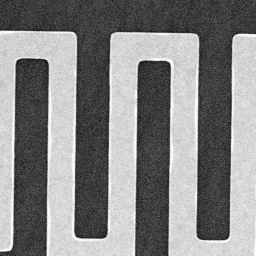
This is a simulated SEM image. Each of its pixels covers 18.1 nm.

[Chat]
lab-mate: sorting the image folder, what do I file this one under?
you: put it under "groups of lines, slits or small figures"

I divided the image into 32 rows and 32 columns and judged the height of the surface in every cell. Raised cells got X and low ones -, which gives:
--------------------------------
--------------------------------
--------------------------------
--------------------------------
XXXXXXXXX-----XXXXXXXXXX-----XXX
XXXXXXXXXX----XXXXXXXXXXX----XXX
XXXXXXXXXX----XXXXXXXXXXX----XXX
XX----XXX-----XXXX---XXXX----XXX
XX----XXX-----XXX-----XXX----XXX
XX----XXX-----XXX-----XXX----XXX
XX----XXX-----XXX----XXXX----XXX
XX----XXX-----XXX----XXXX----XXX
XX----XXX-----XXX-----XXX----XXX
XX----XXX-----XXX-----XXX----XXX
XX----XXX-----XXX----XXXX----XXX
XX----XXX-----XXX----XXXX----XXX
XX----XXX-----XXX----XXXX----XXX
XX----XXX-----XXX----XXXX----XXX
XX----XXX-----XXX----XXXX----XXX
XX----XXX-----XXX----XXXX----XXX
XX----XXX-----XXX----XXXX----XXX
XX----XXX-----XXX----XXXX----XXX
XX----XXX-----XXX----XXXX----XXX
XX----XXX-----XXX----XXXX----XXX
XX----XXX-----XXX----XXXX----XXX
XX----XXX-----XXX----XXXX----XXX
XX----XXX-----XXX----XXXX----XXX
XX----XXX-----XXX----XXXX----XXX
XX----XXX-----XXX----XXX-----XXX
XX----XXX----XXXX----XXXX----XXX
X-----XXXXXXXXXXX----XXXXXXXXXXX
------XXXXXXXXXXX----XXXXXXXXXXX